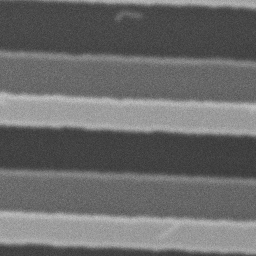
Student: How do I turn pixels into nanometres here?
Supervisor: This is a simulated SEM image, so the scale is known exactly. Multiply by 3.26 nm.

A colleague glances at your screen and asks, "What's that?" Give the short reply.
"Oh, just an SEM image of lines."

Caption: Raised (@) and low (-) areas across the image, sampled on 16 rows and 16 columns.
----------------
----------------
----------------
@@@@------------
@@@@@@@@@@@@@@@@
@@@@@@@@@@@@@@@@
@@@@@@@@@@@@@@@@
@@@@@@@@@@@@@@@@
----------------
----------------
----------------
@@@@@@@@@@@@@@@@
@@@@@@@@@@@@@@@@
@@@@@@@@@@@@@@@@
@@@@@@@@@@@@@@@@
--------@@@@@@@@